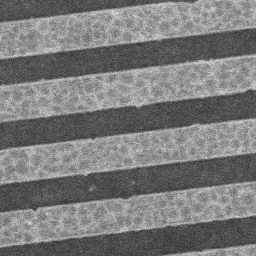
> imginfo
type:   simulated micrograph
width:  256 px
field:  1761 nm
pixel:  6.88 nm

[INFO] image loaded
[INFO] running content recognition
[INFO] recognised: one or a few lines or trenches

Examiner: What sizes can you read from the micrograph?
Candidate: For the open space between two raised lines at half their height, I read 204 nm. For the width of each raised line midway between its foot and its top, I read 0.221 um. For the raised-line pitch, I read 430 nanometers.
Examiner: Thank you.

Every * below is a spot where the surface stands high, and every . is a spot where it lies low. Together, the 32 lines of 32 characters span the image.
....................***.********
............********************
....****************************
******************************..
**********************..........
**************..................
******..........................
...........................*****
....................******.*****
...........*********************
....****************************
*****************************...
*********************...........
*************...................
*****...........................
...........................*****
...................*************
............********************
...*****************************
***************************.....
*******************.............
***********.....................
***.............................
..........................******
..................**************
..........**********************
..******************************
**************************......
******************..............
**********......................
**..............................
..........................******